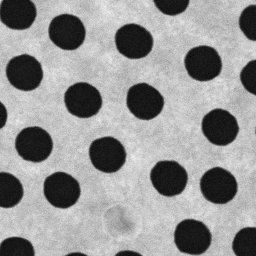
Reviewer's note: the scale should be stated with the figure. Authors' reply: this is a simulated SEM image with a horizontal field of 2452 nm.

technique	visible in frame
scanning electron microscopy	a regular array of holes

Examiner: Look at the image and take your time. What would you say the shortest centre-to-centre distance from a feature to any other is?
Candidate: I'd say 0.562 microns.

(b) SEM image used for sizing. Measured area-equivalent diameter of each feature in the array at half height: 346 nm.